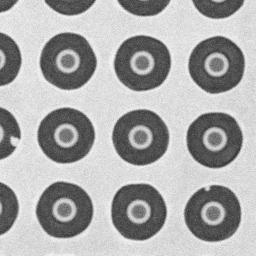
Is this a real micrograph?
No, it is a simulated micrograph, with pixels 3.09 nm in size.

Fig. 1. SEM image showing an array of small figures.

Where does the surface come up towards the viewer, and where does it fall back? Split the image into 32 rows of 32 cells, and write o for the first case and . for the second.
..oooo......ooo......ooo......oo
.oooooo....ooooo....ooooo.....oo
oooooooooooooooooooooooooooooooo
oooooooooooooooooooooooooooooooo
.oooooo...ooooooo..oooooooo.oooo
..oooo.....oooo......oooo.....oo
...oo...o...oo.......ooo......oo
...oo..ooo..oo...oo..ooo..oo...o
...oo...o...oo...oo..oo...oo...o
..ooo.......ooo......ooo......oo
.ooooo.....oooo.....oooo......oo
ooooooooooooooooo.oooooooo..oooo
oooooooooooooooooooooooooooooooo
.oooooo..ooooooooooooooooooooooo
..oooo.....oooo.....ooooo....ooo
..ooo.......oo.......ooo......oo
...oo..oo...oo..ooo..oo...oo..oo
...oo..oo...oo..ooo..oo...oo..oo
..ooo.......oo.......oo...o...oo
.ooooo.....oooo.....oooo......oo
oooooooooooooooo...oooooo....ooo
oooooooooooooooooooooooooooooooo
oooooooooooooooooooooooooooooooo
.ooooo....ooooo....oooooo....ooo
..ooo......ooo......oooo......oo
..ooo..oo...oo...o...oo...o...oo
..oo...oo...oo..ooo..oo..ooo..oo
..ooo.......oo...o...oo...oo..oo
.oooo......ooo......ooo.......oo
oooooo....ooooo....ooooo.....ooo
oooooooooooooooooooooooooooooooo
oooooooooooooooooooooooooooooooo